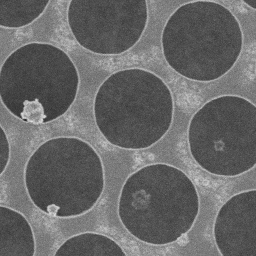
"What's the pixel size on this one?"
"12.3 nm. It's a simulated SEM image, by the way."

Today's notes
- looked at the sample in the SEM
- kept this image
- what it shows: holes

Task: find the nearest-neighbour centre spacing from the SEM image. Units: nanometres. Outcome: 1180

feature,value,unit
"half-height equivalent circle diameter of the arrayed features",976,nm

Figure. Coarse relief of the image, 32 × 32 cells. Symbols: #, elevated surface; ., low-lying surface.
......###.........#####....####.
.....####.........####.......###
....#####.........###.........##
#########.........###.........##
#########.........##..........##
####..####.......###..........##
##......####...#####..........##
#........############.........##
.........#############.......###
..........####......###.....####
..........###........###########
..........##.........###########
.........###..........#####....#
#..##....###..........###.......
##.##..#####..........##........
############.........###........
#############........###........
.#####....###.......####........
.####......####...######........
.###........############........
.##..........############.......
###..........####......###....##
###..........###........########
###..........##.........########
####........###..........####...
####........###..........###....
..#####...#####..........##.....
...############.........###.....
....############........###.....
....######...####......####.....
....####.......####..######.....
....###........#############....